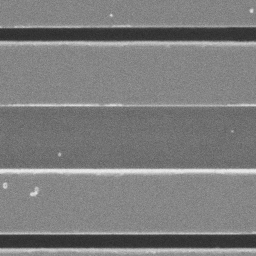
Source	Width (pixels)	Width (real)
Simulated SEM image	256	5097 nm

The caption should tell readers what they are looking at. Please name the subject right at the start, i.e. lines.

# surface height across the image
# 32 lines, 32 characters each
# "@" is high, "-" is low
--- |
@@@@@@@@@@@@@@@@@@@@@@@@@@@@@@@@
@@@@@@@@@@@@@@@@@@@@@@@@@@@@@@@@
@@@@@@@@@@@@@@@@@@@@@@@@@@@@@@@@
--------------------------------
--------------------------------
@@@@@@@@@@@@@@@@@@@@@@@@@@@@@@@@
@@@@@@@@@@@@@@@@@@@@@@@@@@@@@@@@
@@@@@@@@@@@@@@@@@@@@@@@@@@@@@@@@
@@@@@@@@@@@@@@@@@@@@@@@@@@@@@@@@
@@@@@@@@@@@@@@@@@@@@@@@@@@@@@@@@
@@@@@@@@@@@@@@@@@@@@@@@@@@@@@@@@
@@@@@@@@@@@@@@@@@@@@@@@@@@@@@@@@
@@@@@@@@@@@@@@@@@@@@@@@@@@@@@@@@
--------------------------------
--------------------------------
--------------------------------
--------------------------------
--------------------------------
--------------------------------
--------------------------------
--------------------------------
@@@@@@@@@@@@@@@@@@@@@@@@@@@@@@@@
@@@@@@@@@@@@@@@@@@@@@@@@@@@@@@@@
@@@@@@@@@@@@@@@@@@@@@@@@@@@@@@@@
@@@@@@@@@@@@@@@@@@@@@@@@@@@@@@@@
@@@@@@@@@@@@@@@@@@@@@@@@@@@@@@@@
@@@@@@@@@@@@@@@@@@@@@@@@@@@@@@@@
@@@@@@@@@@@@@@@@@@@@@@@@@@@@@@@@
@@@@@@@@@@@@@@@@@@@@@@@@@@@@@@@@
--------------------------------
--------------------------------
@@@@@@@@@@@@@@@@@@@@@@@@@@@@@@@@